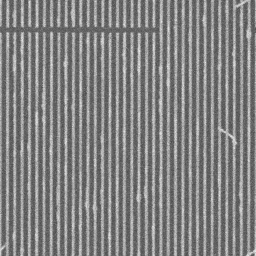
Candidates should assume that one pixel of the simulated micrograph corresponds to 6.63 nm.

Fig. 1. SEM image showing parallel lines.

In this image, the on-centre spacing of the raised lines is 0.0484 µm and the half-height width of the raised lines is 2.01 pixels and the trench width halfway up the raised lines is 0.0323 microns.